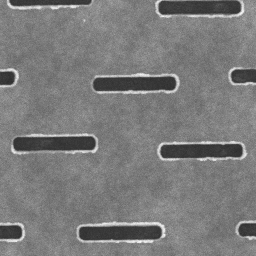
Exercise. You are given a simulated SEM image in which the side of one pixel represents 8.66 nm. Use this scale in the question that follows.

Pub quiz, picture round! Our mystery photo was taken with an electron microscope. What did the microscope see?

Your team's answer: holes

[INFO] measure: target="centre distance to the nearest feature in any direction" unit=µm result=0.844